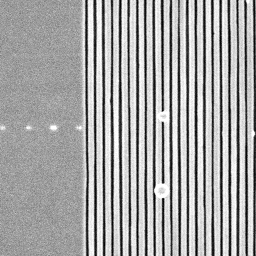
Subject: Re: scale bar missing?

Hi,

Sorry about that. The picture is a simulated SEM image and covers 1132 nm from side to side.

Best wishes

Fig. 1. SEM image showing parallel lines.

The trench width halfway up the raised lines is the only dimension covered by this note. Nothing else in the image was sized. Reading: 12.2 nanometers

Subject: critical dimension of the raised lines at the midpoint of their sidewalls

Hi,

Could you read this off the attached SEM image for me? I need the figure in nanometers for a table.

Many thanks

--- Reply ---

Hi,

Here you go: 24.3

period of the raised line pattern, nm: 37.1